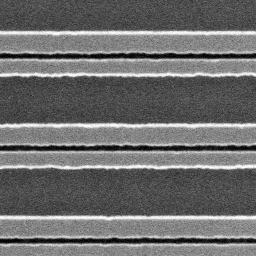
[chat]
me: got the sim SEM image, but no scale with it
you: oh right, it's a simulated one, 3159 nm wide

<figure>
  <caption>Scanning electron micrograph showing lines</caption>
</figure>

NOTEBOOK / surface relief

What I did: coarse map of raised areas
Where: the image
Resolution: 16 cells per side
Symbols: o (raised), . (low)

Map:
................
................
oooooooooooooooo
oooooooooooooooo
oooooooooooooooo
................
................
................
oooooooooooooooo
oooooooooooooooo
....o...........
................
................
................
oooooooooooooooo
oooooooooooooooo